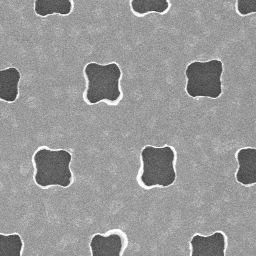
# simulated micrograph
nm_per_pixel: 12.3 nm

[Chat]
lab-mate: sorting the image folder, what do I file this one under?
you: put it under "holes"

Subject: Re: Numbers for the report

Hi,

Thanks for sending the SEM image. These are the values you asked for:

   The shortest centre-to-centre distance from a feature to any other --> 1220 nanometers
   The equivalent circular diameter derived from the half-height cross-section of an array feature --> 488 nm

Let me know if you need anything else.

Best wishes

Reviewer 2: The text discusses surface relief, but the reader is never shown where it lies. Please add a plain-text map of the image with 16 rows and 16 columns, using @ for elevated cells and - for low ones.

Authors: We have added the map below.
@@--@@@@--@@@@@-
@@@@@@@@@@@@@@@@
@@@@@@@@@@@@@@@@
@@@@@@@@@@@@@@@@
-@@@@--@@@@@--@@
-@@@@--@@@@@--@@
@@@@@@@@@@@@@@@@
@@@@@@@@@@@@@@@@
@@@@@@@@@@@@@@@@
@@--@@@@@--@@@@-
@@--@@@@@--@@@@-
@@--@@@@@--@@@@-
@@@@@@@@@@@@@@@@
@@@@@@@@@@@@@@@@
@@@@@@@@@@@@@@@@
-@@@@@--@@@@--@@